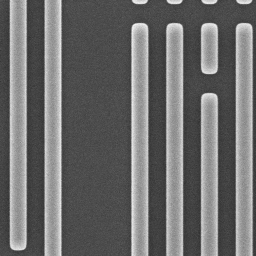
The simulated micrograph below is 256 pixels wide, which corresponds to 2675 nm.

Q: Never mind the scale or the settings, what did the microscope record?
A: groups of lines, slits or small figures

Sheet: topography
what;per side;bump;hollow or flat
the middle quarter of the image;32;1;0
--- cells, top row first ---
00000000000000000111100000111100
00000000000000000111100000111100
00000000000000000111100000111100
00000000000000000111100000111100
00000000000000000111100000111100
00000000000000000111100000111100
00000000000000000111100000111100
00000000000000000111100000111100
00000000000000000111100000111100
00000000000000000111100000111100
00000000000000000111100000111100
00000000000000000111100000111100
00000000000000000111100000111100
00000000000000000111100000111100
00000000000000000111100000111100
00000000000000000111100000111100
00000000000000000111100000111100
00000000000000000111100000111100
00000000000000000111100000111100
00000000000000000111100000111100
00000000000000000111100000111100
00000000000000000111100000111100
00000000000000000111100000111100
00000000000000000111100000111100
00000000000000000111100000111100
00000000000000000111100000111100
00000000000000000111100000111100
00000000000000000111100000111100
00000000000000000111100000111100
00000000000000000111100000111100
00000000000000000111100000111100
00000000000000000111100000111100